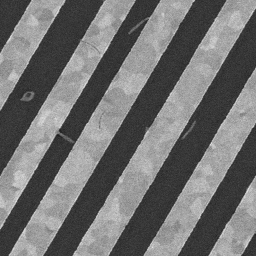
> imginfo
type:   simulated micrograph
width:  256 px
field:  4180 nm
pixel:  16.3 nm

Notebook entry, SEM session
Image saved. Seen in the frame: lines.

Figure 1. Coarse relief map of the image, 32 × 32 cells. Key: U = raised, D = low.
DDDDUUUUDDDDDUUUUDDDUUUUDDDDUUUU
DDDUUUUDDDDDUUUUDDDUUUUDDDDDUUUU
DDDUUUUDDDDDUUUDDDDUUUUDDDDUUUUD
DDUUUUDDDDDUUUUDDDUUUUDDDDUUUUDD
DUUUUDDDDDDUUUDDDUUUUUDDDDUUUUDD
DUUUUDDDDDUUUUDDDUUUUDDDDUUUUDDD
UUUUDDDDDUUUUDDDUUUUDDDDUUUUUDDD
UUUUDDDDDUUUUDDDUUUUDDDDUUUUDDDD
UUUDDDDDUUUUDDDUUUUDDDDUUUUDDDDD
UUUDDDDDUUUDDDUUUUUDDDDUUUUDDDDU
UUDDDDDUUUUDDDUUUUDDDDUUUUDDDDDU
UDDDDDUUUUDDDUUUUDDDDUUUUUDDDDUU
UDDDDDUUUUDDDUUUUDDDDUUUUDDDDDUU
DDDDDUUUUDDDUUUUDDDDUUUUUDDDDUUU
DDDDDUUUDDDDUUUUDDDDUUUUDDDDUUUU
DDDDUUUUDDDUUUUDDDDUUUUDDDDDUUUU
DDDUUUUDDDUUUUUDDDUUUUUDDDDUUUUD
DDDUUUUDDDUUUUDDDDUUUUDDDDDUUUUD
DDUUUUDDDUUUUDDDDUUUUDDDDDUUUUDD
DDUUUDDDDUUUUDDDDUUUUDDDDUUUUDDD
DUUUUDDDUUUUDDDDUUUUDDDDDUUUUDDD
UUUUDDDUUUUUDDDUUUUUDDDDUUUUDDDD
UUUUDDDUUUUDDDDUUUUDDDDDUUUUDDDD
UUUDDDUUUUDDDDUUUUUDDDDUUUUDDDDU
UUDDDDUUUUDDDDUUUUDDDDUUUUUDDDDU
UUDDDUUUUDDDDUUUUDDDDDUUUUDDDDUU
UDDDUUUUUDDDUUUUUDDDDUUUUDDDDUUU
UDDDUUUUDDDDUUUUDDDDDUUUUDDDDUUU
DDDUUUUDDDDUUUUUDDDDUUUUDDDDUUUU
DDDUUUUDDDDUUUUDDDDUUUUUDDDDUUUU
DDUUUUDDDDUUUUDDDDDUUUUDDDDUUUUD
DUUUUUDDDUUUUUDDDDUUUUDDDDUUUUDD